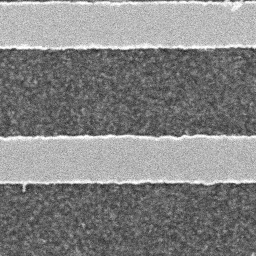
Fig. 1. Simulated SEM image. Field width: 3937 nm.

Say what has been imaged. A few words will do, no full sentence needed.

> one or a few lines or trenches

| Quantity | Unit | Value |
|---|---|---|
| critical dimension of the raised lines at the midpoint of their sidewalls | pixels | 45.9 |